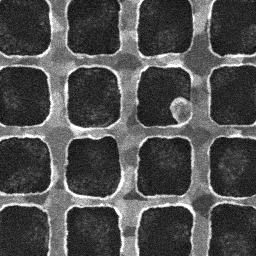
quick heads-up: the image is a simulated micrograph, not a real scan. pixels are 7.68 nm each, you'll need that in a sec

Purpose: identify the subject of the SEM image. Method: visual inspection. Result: holes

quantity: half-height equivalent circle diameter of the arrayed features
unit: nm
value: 476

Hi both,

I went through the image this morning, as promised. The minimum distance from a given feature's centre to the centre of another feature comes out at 534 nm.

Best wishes